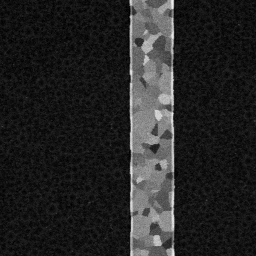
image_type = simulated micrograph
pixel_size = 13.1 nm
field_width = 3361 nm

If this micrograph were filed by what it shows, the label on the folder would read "one or a few lines or trenches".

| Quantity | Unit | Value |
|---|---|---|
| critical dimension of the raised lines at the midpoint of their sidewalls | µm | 0.545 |